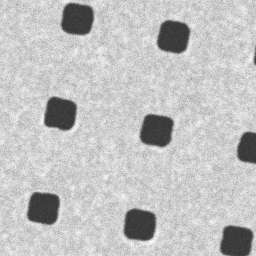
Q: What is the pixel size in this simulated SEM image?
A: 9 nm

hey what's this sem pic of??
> holes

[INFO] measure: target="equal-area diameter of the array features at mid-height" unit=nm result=308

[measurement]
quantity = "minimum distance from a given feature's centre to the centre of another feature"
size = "864 nanometers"